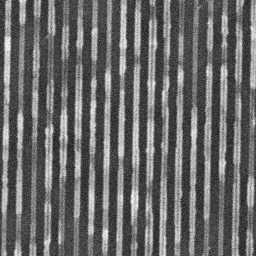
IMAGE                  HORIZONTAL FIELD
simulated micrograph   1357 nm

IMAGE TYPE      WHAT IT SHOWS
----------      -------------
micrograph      parallel lines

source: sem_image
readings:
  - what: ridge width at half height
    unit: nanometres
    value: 28.5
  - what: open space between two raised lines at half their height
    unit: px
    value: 9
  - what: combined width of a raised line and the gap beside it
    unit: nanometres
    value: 76.7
